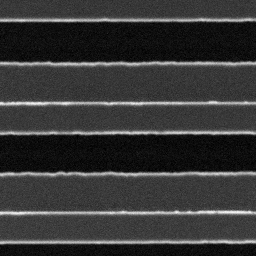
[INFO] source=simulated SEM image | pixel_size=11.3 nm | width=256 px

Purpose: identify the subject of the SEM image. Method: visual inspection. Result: lines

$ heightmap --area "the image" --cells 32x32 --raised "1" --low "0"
11111111111111111111111111111111
11111111111111111111111111111111
11111111111111111111111111111111
00000000000000000000000000000000
00000000000000000000000000000000
00000000000000000000000000000000
00000000000000000000000000000000
00000000000000000000000000000000
11111111111111111111111111111111
11111111111111111111111111111111
11111111111111111111111111111111
11111111111111111111111111111111
11111111111111111111111111111111
11111111111111111111111111111111
11111111111111111111111111111111
11111111111111111111111111111111
11111111111111111111111111111111
00000000000000000000000000000000
00000000000000000000000000000000
00000000000000000000000000000000
00000000000000000000000000000000
00000000000000000000000000000000
11111111111111111111111111111111
11111111111111111111111111111111
11111111111111111111111111111111
11111111111111111111111111111111
11111111111111111111111111111111
11111111111111111111111111111111
11111111111111111111111111111111
11111111111111111111111111111111
00000000000000000000000000000000
00000000000000000000000000000000